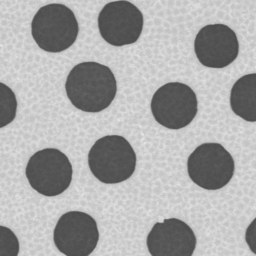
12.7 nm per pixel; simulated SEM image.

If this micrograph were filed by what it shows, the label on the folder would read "holes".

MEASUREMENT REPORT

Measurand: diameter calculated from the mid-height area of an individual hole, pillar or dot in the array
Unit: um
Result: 0.595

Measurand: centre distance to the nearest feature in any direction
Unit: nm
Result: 877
